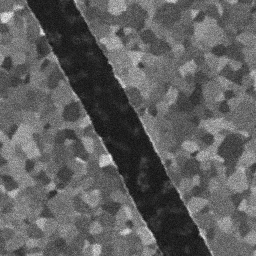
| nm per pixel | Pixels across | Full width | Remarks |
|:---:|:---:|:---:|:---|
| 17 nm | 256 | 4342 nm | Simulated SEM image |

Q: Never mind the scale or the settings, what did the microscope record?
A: one or a few lines or trenches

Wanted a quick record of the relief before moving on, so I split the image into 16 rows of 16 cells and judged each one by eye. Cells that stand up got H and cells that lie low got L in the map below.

HHLLLHHHHHHHHHHH
HHLLLHHHHHHHHHHH
HHHLLLHHHHHHHHHH
HHHLLLLHHHHHHHHH
HHHHLLLHHHHHHHHH
HHHHLLLLHHHHHHHH
HHHHHLLLHHHHHHHH
HHHHHHLLLHHHHHHH
HHHHHHLLLHHHHHHH
HHHHHHHLLLHHHHHH
HHHHHHHLLLHHHHHH
HHHHHHHHLLLHHHHH
HHHHHHHHLLLHHHHH
HHHHHHHHHLLLHHHH
HHHHHHHHHLLLLHHH
HHHHHHHHHHLLLHHH